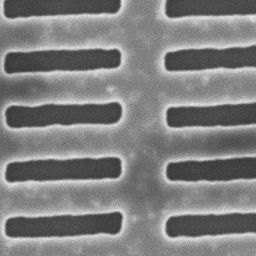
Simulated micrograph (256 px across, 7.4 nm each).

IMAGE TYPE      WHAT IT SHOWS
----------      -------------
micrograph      holes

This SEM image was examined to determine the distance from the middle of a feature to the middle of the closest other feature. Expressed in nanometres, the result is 404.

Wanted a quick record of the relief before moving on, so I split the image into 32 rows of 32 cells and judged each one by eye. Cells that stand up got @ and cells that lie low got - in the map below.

---------------@@@@@@-----------
---------------@@@@@@-----------
@@@@@@@@@@@@@@@@@@@@@@@@@@@@@@@@
@@@@@@@@@@@@@@@@@@@@@@@@@@@@@@@@
@@@@@@@@@@@@@@@@@@@@@@@@@@@@@@@@
@@@@@@@@@@@@@@@@@@@@@@@@@@@@@@@@
@--------------@@@@@@-----------
@--------------@@@@@------------
@-------------@@@@@@@----------@
@@@@@@@@@@@@@@@@@@@@@@@@@@@@@@@@
@@@@@@@@@@@@@@@@@@@@@@@@@@@@@@@@
@@@@@@@@@@@@@@@@@@@@@@@@@@@@@@@@
@@@@@@@@@@@@@@@@@@@@@@@@@@@@@@@@
@--------------@@@@@@-----------
@--------------@@@@@@-----------
@---------@@--@@@@@@@-----------
@@@@@@@@@@@@@@@@@@@@@@@@@@@@@@@@
@@@@@@@@@@@@@@@@@@@@@@@@@@@@@@@@
@@@@@@@@@@@@@@@@@@@@@@@@@@@@@@@@
@@@@@@@@@@@@@@@@@@@@@@@@@@@@@@@@
@--------------@@@@@@-----------
@--------------@@@@@@-----------
@-----------@@@@@@@@@----------@
@@@@@@@@@@@@@@@@@@@@@@@@@@@@@@@@
@@@@@@@@@@@@@@@@@@@@@@@@@@@@@@@@
@@@@@@@@@@@@@@@@@@@@@@@@@@@@@@@@
@@@@@@@@@@@@@@-@@@@@@@@@@@@@@@@-
@--------------@@@@@@-----------
@--------------@@@@@@-----------
@---------@@@@@@@@@@@-----@@@@@@
@@@@@@@@@@@@@@@@@@@@@@@@@@@@@@@@
@@@@@@@@@@@@@@@@@@@@@@@@@@@@@@@@